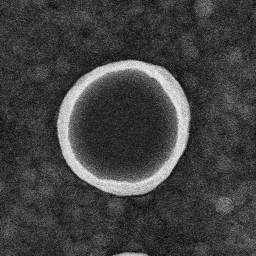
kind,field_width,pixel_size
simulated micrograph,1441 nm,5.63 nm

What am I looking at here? raised bodies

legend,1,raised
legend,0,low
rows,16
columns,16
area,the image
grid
0000000000000000
0000000000000000
0000000000000000
0000000000000000
0000001111000000
0000011111100000
0000111111100000
0000111111110000
0000111111110000
0000111111100000
0000011111100000
0000001110000000
0000000000000000
0000000000000000
0000000000000000
0000000000000000